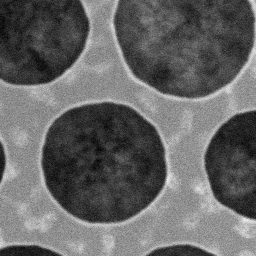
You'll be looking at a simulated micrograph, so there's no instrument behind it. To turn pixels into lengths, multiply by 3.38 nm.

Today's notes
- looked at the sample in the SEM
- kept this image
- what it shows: holes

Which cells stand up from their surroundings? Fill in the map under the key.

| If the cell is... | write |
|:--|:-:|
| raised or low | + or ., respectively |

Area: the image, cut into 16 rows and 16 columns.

.....++.........
......+.........
.....++.........
.....+++........
....++++.......+
++++++++++....++
++++++.+++++++++
+++......+++++..
+++.......+++...
+++.......+++...
+++.......+++...
+++.......+++...
+++.......++++..
+++++...+++++++.
++++++++++++++++
...+++++++..++++